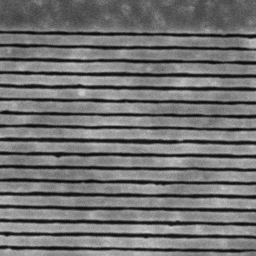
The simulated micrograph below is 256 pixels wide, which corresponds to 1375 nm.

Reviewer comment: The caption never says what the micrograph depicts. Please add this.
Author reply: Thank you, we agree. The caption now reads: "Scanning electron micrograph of parallel lines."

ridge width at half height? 52.3 nanometers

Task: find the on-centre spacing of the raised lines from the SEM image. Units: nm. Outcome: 72.1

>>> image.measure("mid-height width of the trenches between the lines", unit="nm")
16.1